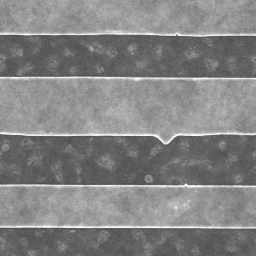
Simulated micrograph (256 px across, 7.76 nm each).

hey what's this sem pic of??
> one or a few lines or trenches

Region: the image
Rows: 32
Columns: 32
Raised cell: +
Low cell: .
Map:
++++++++++++++++++++++++++++++++
++++++++++++++++++++++++++++++++
++++++++++++++++++++++++++++++++
++++++++++++++++++++++++++++++++
........................++......
................................
................................
................................
................................
................................
++++++++++++++++++++++++++++++++
++++++++++++++++++++++++++++++++
++++++++++++++++++++++++++++++++
++++++++++++++++++++++++++++++++
++++++++++++++++++++++++++++++++
++++++++++++++++++++++++++++++++
++++++++++++++++++++++++++++++++
....................+...........
................................
................................
................................
................................
................................
++++++++++++++++++++++++++++++++
++++++++++++++++++++++++++++++++
++++++++++++++++++++++++++++++++
++++++++++++++++++++++++++++++++
++++++++++++++++++++++++++++++++
................................
................................
................................
................................